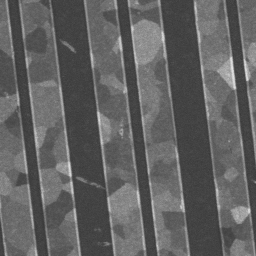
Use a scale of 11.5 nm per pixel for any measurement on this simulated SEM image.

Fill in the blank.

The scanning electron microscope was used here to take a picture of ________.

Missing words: parallel lines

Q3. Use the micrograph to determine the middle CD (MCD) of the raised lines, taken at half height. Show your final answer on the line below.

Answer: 357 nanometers